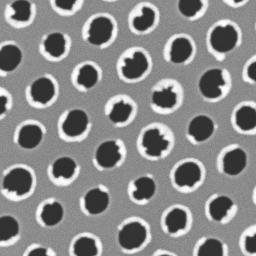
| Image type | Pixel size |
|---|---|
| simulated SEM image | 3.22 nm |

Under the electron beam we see a regular array of holes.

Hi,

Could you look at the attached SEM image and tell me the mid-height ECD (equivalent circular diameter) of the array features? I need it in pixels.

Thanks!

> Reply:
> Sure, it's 24.8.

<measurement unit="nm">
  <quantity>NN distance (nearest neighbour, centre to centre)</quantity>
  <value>146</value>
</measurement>